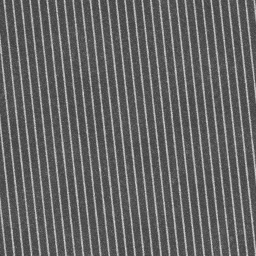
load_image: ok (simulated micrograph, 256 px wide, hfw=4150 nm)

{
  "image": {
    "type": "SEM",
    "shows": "parallel lines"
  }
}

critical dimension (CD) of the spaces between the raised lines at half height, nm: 121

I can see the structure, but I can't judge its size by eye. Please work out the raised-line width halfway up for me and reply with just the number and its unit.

16.1 nm